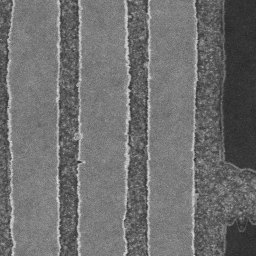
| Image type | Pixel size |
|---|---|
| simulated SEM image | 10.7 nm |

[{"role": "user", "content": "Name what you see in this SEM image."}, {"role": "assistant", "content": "one or a few lines or trenches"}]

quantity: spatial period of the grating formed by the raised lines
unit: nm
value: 732